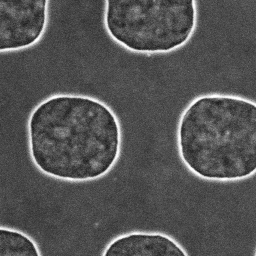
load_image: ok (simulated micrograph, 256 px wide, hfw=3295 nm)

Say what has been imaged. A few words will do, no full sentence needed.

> holes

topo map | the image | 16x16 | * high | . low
...****.....****
...****.....****
..*****.....****
****************
****************
****************
***...******....
**.....****.....
**.....****.....
**.....****.....
***....*****....
****************
****************
****************
.***************
..*****....*****